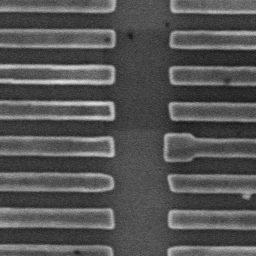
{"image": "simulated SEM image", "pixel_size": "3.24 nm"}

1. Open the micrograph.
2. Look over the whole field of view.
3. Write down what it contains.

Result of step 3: wiring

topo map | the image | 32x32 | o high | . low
oooooooooooooo.......ooooooooooo
......oooooooo........oooooooooo
................................
................................
oooooooooooooo.......ooooooooooo
oooooooooooooo.......ooooooooooo
................................
................................
oooooooooooooo.......ooooooooooo
oooooooooooooo.......ooooooooooo
.....ooooooooo........oooooooooo
................................
................................
oooooooooooooo.......ooooooooooo
oooooooooooooo.......ooooooooooo
................................
................................
oooooooooooooo.......ooooooooooo
oooooooooooooo.......ooooooooooo
............oo.......ooooooooooo
................................
................................
oooooooooooooo.......ooooooooooo
oooooooooooooo.......ooooooooooo
................................
................................
oooooooooooooo.......ooooooooooo
oooooooooooooo.......ooooooooooo
............oo.......ooooooooooo
................................
................................
oooooooooooooo.......ooooooooooo